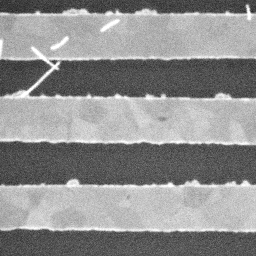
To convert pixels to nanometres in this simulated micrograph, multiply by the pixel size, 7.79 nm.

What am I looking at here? lines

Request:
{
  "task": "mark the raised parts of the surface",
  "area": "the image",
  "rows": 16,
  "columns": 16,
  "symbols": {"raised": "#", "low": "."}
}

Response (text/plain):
................
################
################
################
................
................
################
################
################
................
................
................
################
################
................
................